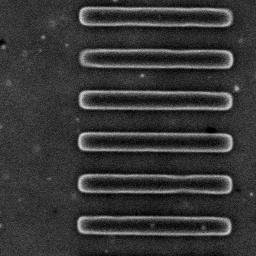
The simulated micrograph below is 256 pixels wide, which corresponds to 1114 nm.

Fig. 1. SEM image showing groups of lines, slits or small figures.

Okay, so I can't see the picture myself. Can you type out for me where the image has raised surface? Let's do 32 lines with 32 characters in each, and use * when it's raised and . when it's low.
................................
..........*******************...
..........*******************...
................................
................................
................................
...........******************...
..........*******************...
................................
................................
................................
...........********.............
..........*******************...
...........*****************....
................................
................................
................................
..........*******************...
..........*******************...
................................
................................
................................
..........*******************...
..........*******************...
................................
................................
................................
..........******************....
..........*******************...
................................
................................
................................